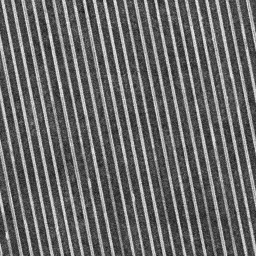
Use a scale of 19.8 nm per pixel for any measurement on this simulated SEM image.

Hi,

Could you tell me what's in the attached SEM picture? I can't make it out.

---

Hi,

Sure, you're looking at parallel lines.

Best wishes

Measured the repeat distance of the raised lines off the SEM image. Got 10 pixels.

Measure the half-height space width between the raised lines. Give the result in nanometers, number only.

160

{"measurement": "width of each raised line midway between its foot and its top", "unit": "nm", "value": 31.6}